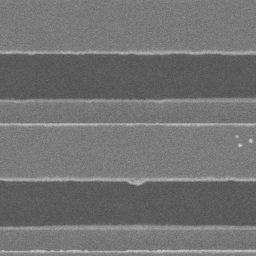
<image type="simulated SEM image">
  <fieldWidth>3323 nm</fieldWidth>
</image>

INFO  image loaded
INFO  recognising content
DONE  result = lines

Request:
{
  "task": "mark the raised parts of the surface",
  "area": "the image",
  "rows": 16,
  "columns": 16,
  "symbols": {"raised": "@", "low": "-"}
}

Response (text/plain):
@@@@@@@@@@@@@@@@
@@@@@@@@@@@@@@@@
@@@@@@@@@@@@@@@@
----------------
----------------
----------------
@@@@@@@@@@@@@@@@
@@@@@@@@@@@@@@@@
@@@@@@@@@@@@@@@@
@@@@@@@@@@@@@@@@
@@@@@@@@@@@@@@@@
----------------
----------------
----------------
@@@@@@@@@@@@@@@@
@@@@@@@@@@@@@@@@